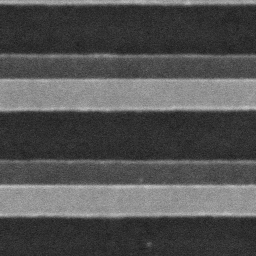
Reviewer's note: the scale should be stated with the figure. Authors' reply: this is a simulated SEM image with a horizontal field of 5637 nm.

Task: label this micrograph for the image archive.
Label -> lines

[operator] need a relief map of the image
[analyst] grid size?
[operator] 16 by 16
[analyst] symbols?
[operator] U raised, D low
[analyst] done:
DDDDDDDDDDDDDDDD
DDDDDDDDDDDDDDDD
DDDDDDDDDDDDDDDD
DDDDDDDDDDDDDDDD
UUUUUUUUUUUUUUUU
UUUUUUUUUUUUUUUU
UUUUUUUUUUUUUUUU
DDDDDDDDDDDDDDDD
DDDDDDDDDDDDDDDD
DDDDDDDDDDDDDDDD
UUUUUUUUUUUUUUUU
UUUUUUUUUUUUUUUU
UUUUUUUUUUUUUUUU
DDDDDDDDDDDDDDDD
DDDDDDDDDDDDDDDD
DDDDDDDDDDDDDDDD